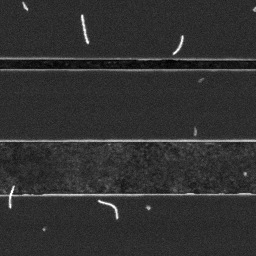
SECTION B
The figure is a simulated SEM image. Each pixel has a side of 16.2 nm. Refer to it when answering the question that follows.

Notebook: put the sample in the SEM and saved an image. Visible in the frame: lines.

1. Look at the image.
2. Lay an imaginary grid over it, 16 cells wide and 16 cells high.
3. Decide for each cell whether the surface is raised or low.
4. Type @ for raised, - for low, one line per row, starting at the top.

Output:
@@@@@@@@@@@@@@@@
@@@@@@@@@@@@@@@@
@@@@@@@@@@@@@@@@
@@@@@@@@@@@@@@@@
@@@@@@@@@@@@@@@@
@@@@@@@@@@@@@@@@
@@@@@@@@@@@@@@@@
@@@@@@@@@@@@@@@@
@@@@@@@@@@@@@@@@
----------------
----------------
----------------
@@@@@@@@@@@@@@@@
@@@@@@@@@@@@@@@@
@@@@@@@@@@@@@@@@
@@@@@@@@@@@@@@@@